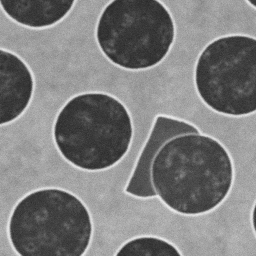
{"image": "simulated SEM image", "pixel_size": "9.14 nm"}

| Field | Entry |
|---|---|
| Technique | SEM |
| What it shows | holes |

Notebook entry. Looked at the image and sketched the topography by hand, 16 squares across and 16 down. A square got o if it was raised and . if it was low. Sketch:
....ooo...oooooo
o..ooo.....ooooo
oooooo.....ooo..
.oooooo...ooo...
..oooooooooo....
..oooooooooo....
..oo....ooooo...
.ooo....oo.ooooo
ooo.....o....ooo
oooo....o.....oo
ooooo.oo......oo
oooooooo......oo
o....ooooo....oo
o.....oooooooooo
o.....oooooooooo
o....ooo...ooooo